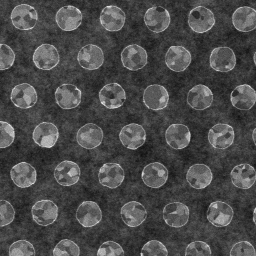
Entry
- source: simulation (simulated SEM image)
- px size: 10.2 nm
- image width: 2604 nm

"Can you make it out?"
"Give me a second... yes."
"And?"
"a regular array of raised bodies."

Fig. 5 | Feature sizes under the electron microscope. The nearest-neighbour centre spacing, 443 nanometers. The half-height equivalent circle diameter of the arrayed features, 256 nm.